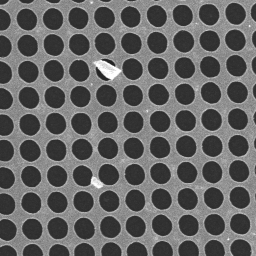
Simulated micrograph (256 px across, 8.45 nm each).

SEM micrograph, a regular array of holes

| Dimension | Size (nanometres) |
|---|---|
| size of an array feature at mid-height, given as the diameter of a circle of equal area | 178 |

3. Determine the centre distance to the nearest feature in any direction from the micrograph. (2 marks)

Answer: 217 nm